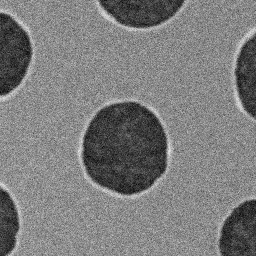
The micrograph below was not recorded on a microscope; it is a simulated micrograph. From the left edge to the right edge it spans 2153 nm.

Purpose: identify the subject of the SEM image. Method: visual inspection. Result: holes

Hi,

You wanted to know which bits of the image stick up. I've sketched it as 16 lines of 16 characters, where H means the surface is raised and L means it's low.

HHHHHHLLLLLHHHHH
LHHHHHHHLLHHHHHH
LLHHHHHHHHHHHHHL
LLHHHHHHHHHHHHHL
LLHHHHHHHHHHHHHL
LHHHHHHHHHHHHHHL
HHHHHHHLLHHHHHHL
HHHHHHLLLLHHHHHH
HHHHHLLLLLHHHHHH
HHHHHLLLLLHHHHHH
HHHHHLLLLLHHHHHH
HHHHHHLLLLHHHHHH
LHHHHHHHHHHHHHHH
LHHHHHHHHHHHHHLL
LHHHHHHHHHHHHHLL
LHHHHHHHHHHHHHLL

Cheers